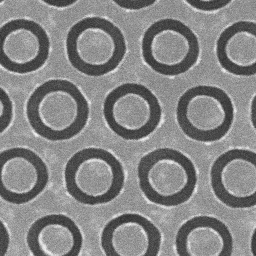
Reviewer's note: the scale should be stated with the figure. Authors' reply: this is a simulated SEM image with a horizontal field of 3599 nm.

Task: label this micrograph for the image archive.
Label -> ring-shaped grooves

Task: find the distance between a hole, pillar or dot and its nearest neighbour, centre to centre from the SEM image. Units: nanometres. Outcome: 1020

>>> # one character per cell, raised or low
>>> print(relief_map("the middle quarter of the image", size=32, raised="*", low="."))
**...........********...........
***.........**********.........*
*****......*************.....***
********************************
..******************************
...***********......************
....********.........**********.
*....******...........********..
**...*****....*****....******...
***...****...********...*****...
***...****..*********...****...*
***...****..*********...****...*
***...****..*********...****...*
***...****...********...****...*
**....****...********...*****..*
*....******....****....******...
....********...........******...
...**********.........********..
..************......************
********************************
********************************
****.......***********......****
***.........********..........**
**...........******............*
*....*****....*****.....****....
....********..****....*******...
....********...***....********..
...*********...***...**********.
...*********...****..**********.
...*********...****..**********.
....*******....****...********..
*...*******...*****....******...